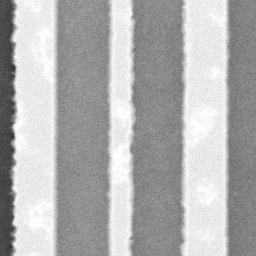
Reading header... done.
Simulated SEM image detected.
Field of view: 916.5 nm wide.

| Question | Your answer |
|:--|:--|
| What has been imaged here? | one or a few lines or trenches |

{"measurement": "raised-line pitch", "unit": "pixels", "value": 85.5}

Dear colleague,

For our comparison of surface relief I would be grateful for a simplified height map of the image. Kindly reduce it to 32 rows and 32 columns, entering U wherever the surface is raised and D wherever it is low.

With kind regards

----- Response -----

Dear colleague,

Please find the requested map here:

DDUUUUUDDDDDDDUUDDDDDDDUUUUUDDDD
DDUUUUUDDDDDDDUUDDDDDDDUUUUUDDDD
DDUUUUUDDDDDDDUUDDDDDDDUUUUUDDDD
DDUUUUUDDDDDDDUUDDDDDDDUUUUUDDDD
DUUUUUUDDDDDDDUUDDDDDDDUUUUUDDDD
DDUUUUUDDDDDDDUUDDDDDDDUUUUUDDDD
DDUUUUUDDDDDDDUUDDDDDDDUUUUUDDDD
DDUUUUUDDDDDDDUUDDDDDDDUUUUUDDDD
DDUUUUUDDDDDDDUUDDDDDDDUUUUUDDDD
DDUUUUUDDDDDDDUUDDDDDDDUUUUUDDDD
DDUUUUUDDDDDDDUUDDDDDDDUUUUUDDDD
DDUUUUUDDDDDDDUUDDDDDDDUUUUUDDDD
DDUUUUUDDDDDDDUUDDDDDDDUUUUUDDDD
DDUUUUUDDDDDDDUUDDDDDDDUUUUUDDDD
DDUUUUUDDDDDDDUUDDDDDDDUUUUUDDDD
DDUUUUUDDDDDDDUUDDDDDDDUUUUUDDDD
DDUUUUUDDDDDDDUUDDDDDDDUUUUUDDDD
DDUUUUUDDDDDDDUUDDDDDDDUUUUUDDDD
DDUUUUUDDDDDDDUUDDDDDDDUUUUUDDDD
DDUUUUUDDDDDDDUUDDDDDDDUUUUUDDDD
DDUUUUUDDDDDDDUUDDDDDDDUUUUUDDDD
DDUUUUUDDDDDDDUUDDDDDDDUUUUUDDDD
DDUUUUUDDDDDDDUUDDDDDDDUUUUUDDDD
DDUUUUUDDDDDDDUUDDDDDDDUUUUUDDDD
DDUUUUUDDDDDDDUUDDDDDDDUUUUUDDDD
DDUUUUUDDDDDDDUUDDDDDDDUUUUUDDDD
DDUUUUUDDDDDDDUUDDDDDDDUUUUUDDDD
DDUUUUUDDDDDDDUUDDDDDDDUUUUUDDDD
DDUUUUUDDDDDDDUUDDDDDDDUUUUUDDDD
DDUUUUUDDDDDDDUUDDDDDDDUUUUUDDDD
DDUUUUUDDDDDDDUUDDDDDDDUUUUUDDDD
DDUUUUUDDDDDDDUUDDDDDDDUUUUUDDDD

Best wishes